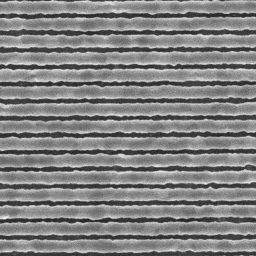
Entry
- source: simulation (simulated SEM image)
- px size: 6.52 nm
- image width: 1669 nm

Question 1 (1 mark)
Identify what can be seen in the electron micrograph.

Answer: parallel lines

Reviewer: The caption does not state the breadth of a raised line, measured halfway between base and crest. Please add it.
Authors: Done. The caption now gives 0.079 um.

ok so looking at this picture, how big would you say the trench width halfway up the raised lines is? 0.0309 µm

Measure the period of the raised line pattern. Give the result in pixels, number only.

17